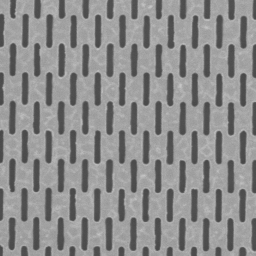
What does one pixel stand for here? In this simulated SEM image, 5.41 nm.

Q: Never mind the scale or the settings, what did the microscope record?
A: a regular array of holes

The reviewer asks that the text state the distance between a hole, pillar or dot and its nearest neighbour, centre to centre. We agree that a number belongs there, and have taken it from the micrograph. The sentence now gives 130 nm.